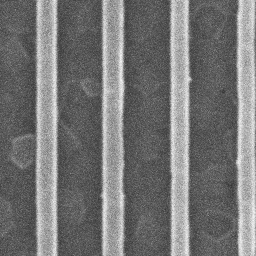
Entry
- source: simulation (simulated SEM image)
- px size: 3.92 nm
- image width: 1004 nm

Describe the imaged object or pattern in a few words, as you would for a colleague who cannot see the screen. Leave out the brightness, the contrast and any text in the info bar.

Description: one or a few lines or trenches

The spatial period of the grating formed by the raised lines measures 66.7 px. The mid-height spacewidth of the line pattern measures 193 nanometres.